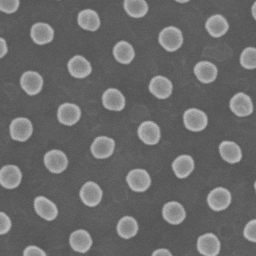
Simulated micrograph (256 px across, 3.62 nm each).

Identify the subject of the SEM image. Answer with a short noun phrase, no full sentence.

a regular array of raised bodies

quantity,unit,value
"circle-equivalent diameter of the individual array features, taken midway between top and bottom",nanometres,77.4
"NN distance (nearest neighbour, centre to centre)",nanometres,171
